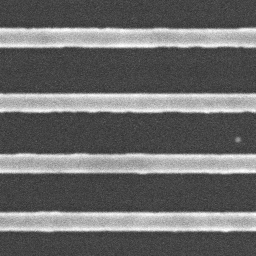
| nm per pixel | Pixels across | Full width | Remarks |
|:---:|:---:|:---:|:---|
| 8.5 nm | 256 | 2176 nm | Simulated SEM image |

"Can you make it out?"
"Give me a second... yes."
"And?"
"lines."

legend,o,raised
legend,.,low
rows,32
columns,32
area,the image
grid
................................
................................
................................
................................
oooooooooooooooooooooooooooooooo
oooooooooooooooooooooooooooooooo
................................
................................
................................
................................
................................
................................
oooooooooooooooooooooooooooooooo
oooooooooooooooooooooooooooooooo
................................
................................
................................
................................
................................
ooooooooooooooooooooooooooo.oooo
oooooooooooooooooooooooooooooooo
oooooooooooooooooooooooooooooooo
................................
................................
................................
................................
................................
oooooooooooooooooooooooooooooooo
oooooooooooooooooooooooooooooooo
................................
................................
................................